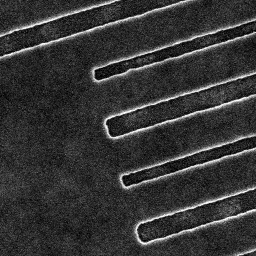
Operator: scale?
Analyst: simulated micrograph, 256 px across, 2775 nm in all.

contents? parallel lines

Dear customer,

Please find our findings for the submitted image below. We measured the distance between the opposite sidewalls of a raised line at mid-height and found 427 nanometers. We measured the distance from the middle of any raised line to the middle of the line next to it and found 0.59 micrometres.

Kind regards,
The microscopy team